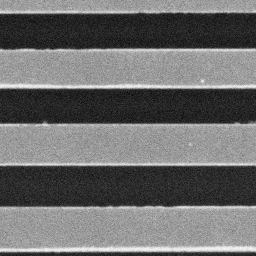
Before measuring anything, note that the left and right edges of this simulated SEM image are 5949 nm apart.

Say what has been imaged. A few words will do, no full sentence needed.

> lines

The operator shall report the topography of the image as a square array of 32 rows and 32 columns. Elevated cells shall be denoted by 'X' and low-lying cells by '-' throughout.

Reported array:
XXXXXXXXXXXXXXXXXXXXXXXXXXXXXXXX
XXXXXXXXXXXXXXXXX-XX------------
--------------------------------
--------------------------------
--------------------------------
--------------------------------
XXXXXXXXXXXXXXXXXXXXXXXXXXXXXXXX
XXXXXXXXXXXXXXXXXXXXXXXXXXXXXXXX
XXXXXXXXXXXXXXXXXXXXXXXXXXXXXXXX
XXXXXXXXXXXXXXXXXXXXXXXXXXXXXXXX
XXXXXXXXXXXXXXXXXXXXXXXXXXXXXXXX
--------------------------------
--------------------------------
--------------------------------
--------------------------------
--------------------------------
XXXXXXXXXXXXXXXXXXXXXXXXXXXXXXXX
XXXXXXXXXXXXXXXXXXXXXXXXXXXXXXXX
XXXXXXXXXXXXXXXXXXXXXXXXXXXXXXXX
XXXXXXXXXXXXXXXXXXXXXXXXXXXXXXXX
XXXXXXXXXXXXXXXXXXXXXXXXXXXXXXXX
--------------------------------
--------------------------------
--------------------------------
--------------------------------
--------------------------------
XXXXXXXXXXXXXXXXXXXXXXXXXXXXXXXX
XXXXXXXXXXXXXXXXXXXXXXXXXXXXXXXX
XXXXXXXXXXXXXXXXXXXXXXXXXXXXXXXX
XXXXXXXXXXXXXXXXXXXXXXXXXXXXXXXX
XXXXXXXXXXXXXXXXXXXXXXXXXXXXXXXX
--------------------------------